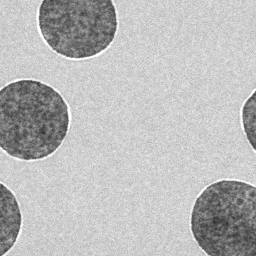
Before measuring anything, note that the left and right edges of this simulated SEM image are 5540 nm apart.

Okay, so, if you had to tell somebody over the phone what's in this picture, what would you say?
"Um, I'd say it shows holes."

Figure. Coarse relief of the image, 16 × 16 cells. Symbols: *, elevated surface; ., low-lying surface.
**.....*********
**.....*********
***....*********
****..**********
****************
...*************
....***********.
....***********.
....***********.
...*************
****************
*************..*
.***********....
.***********....
.***********....
.************...